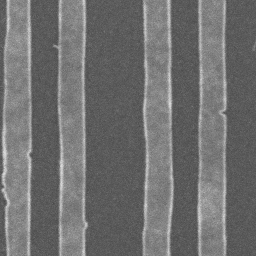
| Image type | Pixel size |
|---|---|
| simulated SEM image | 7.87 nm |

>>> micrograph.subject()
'one or a few lines or trenches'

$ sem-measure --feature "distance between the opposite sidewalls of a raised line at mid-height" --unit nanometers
202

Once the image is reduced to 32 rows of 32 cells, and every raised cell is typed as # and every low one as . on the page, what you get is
.###....###.......###....###....
.###...####.......###....###....
.###....###.......###....###....
.###....###.......###....###....
.###...####.......###....###....
.###...####.......###....###....
.###...###........###....###....
.###...###........###....###....
.###...###........###....###....
.###...###........###....###....
.###...###........###....###....
.###...###........###....###....
.###...###........###....###....
####...###........###....###....
####...###........###....###....
####...###........###....###....
####....###.......###....###....
####....###.......###....###....
.###....##........###....###....
.###....###.......###....###....
.###....###.......####...###....
.###....###.......####...###....
####....###.......####...###....
####....###.......####...###....
.###....##........####...###....
.###....##........####...###....
.###....##........###....###....
.###....###.......###....###....
.###....###.......###....###....
.###....##........###....###....
.###....##........###....###....
.###....##........###....###....